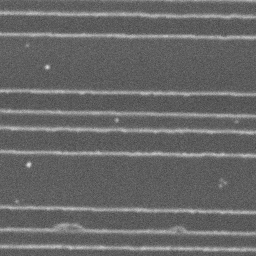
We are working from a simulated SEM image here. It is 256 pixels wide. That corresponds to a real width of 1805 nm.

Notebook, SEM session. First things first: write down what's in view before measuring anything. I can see lines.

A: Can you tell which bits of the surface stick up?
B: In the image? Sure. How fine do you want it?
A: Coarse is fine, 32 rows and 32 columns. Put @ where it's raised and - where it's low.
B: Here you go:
@@@@@@@@@@@@@@@@@@@@@@@@@@@@@@@@
@@@@@@@@@@@@@@@@@@@@@@@@@@@@@@@@
--------------------------------
--------------------------------
@@@@@@@@@@@@@@@@@@@@@@@@@-------
@@@@@@@@@@@@@@@@@@@@@@@@@@@@@@@@
@@@@@@@@@@@@@@@@@@@@@@@@@@@@@@@@
@@@@@@@@@@@@@@@@@@@@@@@@@@@@@@@@
@@@@@@@@@@@@@@@@@@@@@@@@@@@@@@@@
@@@@@@@@@@@@@@@@@@@@@@@@@@@@@@@@
@@@@@@@@@@@@@@@@@@@@@@@@@@@@@@@@
@---@@@@@@@@@@@@@@@@@@@@@@@@@@@@
--------------------------------
--------------------------------
@@@@@@@@@@@@@@@@@@@@@@@@@@@@@@@@
@@@@@@@@@@@@@@@@@@@@@@@@@@@@@@@@
-------------------@-@----@@@@@@
--------------------------------
--------------------------------
@@@@@@@@@@@@@@@@@@@@@@@@@@@@@@@@
@@@@@@@@@@@@@@@@@@@@@@@@@@@@@@@@
@@@@@@@@@@@@@@@@@@@@@@@@@@@@@@@@
@@@@@@@@@@@@@@@@@@@@@@@@@@@@@@@@
@@@@@@@@@@@@@@@@@@@@@@@@@@@@@@@@
@@@@@@@@@@@@@@@@@@@@@@@@@@@@@@@@
@@@@@@@@@@@@@@@@@@@@@@@@@@@@@@@@
---------------------------@@@@@
--------------------------------
-------@@@----------------------
@@@@@@@@@@@@@@@@@@@@@@@@@@@@@@@@
@@@@@@@@@@@@@@@@@@@@@@@@@@@@@@@@
--------------------------------